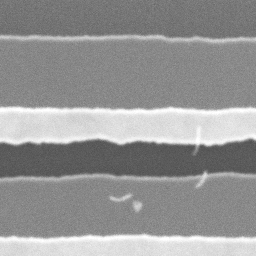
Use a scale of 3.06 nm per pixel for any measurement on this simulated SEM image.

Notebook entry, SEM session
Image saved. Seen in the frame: lines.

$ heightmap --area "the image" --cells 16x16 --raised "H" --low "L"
LLLLLLLLLLLLLLLL
LLLLLLLLLLLLLLLL
HHHHHHHHHHHHHHHH
HHHHHHHHHHHHHHHH
HHHHHHHHHHHHHHHH
HHHHHHHHHHHHHHHH
HHHHHHHHHHHHHHHH
HHHHHHHHHHHHHHHH
HHHHHHHHHHHHHHHH
LLLLLLLLLLLLLLLL
LLLLLLLLLLLLLLLL
HHHHHHHHHHHHHHHH
HHHHHHHHHHHHHHHH
HHHHHHHHHHHHHHHH
HHHHHHHHHHHHHHHH
HHHHHHHHHHHHHHHH